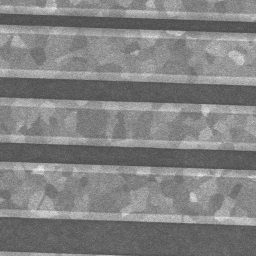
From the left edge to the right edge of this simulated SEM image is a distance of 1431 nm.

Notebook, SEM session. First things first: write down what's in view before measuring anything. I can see one or a few lines or trenches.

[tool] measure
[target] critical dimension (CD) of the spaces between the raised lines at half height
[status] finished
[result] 148 nm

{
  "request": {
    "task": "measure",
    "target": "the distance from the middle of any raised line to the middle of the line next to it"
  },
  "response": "69.2 px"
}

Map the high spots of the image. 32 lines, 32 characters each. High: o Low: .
oooooooooooooooooooooooooooooooo
............oooooooooooooooooooo
................................
................................
oooooooooooooooooooooooo........
oooooooooooooooooooooooooooooooo
oooooooooooooooooooooooooooooooo
oooooooooooooooooooooooooooooooo
oooooooooooooooooooooooooooooooo
...........o..oooooooooooooooooo
................................
................................
................................
ooooooooooooooooooooooooo.......
oooooooooooooooooooooooooooooooo
oooooooooooooooooooooooooooooooo
oooooooooooooooooooooooooooooooo
......oooooooooooooooooooooooooo
................................
................................
................................
oooooooooooooooooooooooo........
oooooooooooooooooooooooooooooooo
oooooooooooooooooooooooooooooooo
oooooooooooooooooooooooooooooooo
oooooooooooooooooooooooooooooooo
oooooooooooooooooooooooooooooooo
..........................oooooo
................................
................................
................................
................................